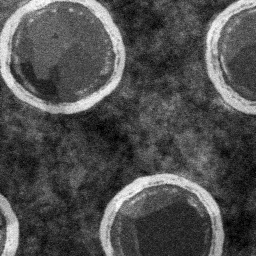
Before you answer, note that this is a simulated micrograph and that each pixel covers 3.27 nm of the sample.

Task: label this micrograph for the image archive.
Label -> raised bodies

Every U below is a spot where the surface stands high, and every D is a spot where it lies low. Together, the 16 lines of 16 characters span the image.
DDUUUUDDDDDDDDDU
DUUUUUUDDDDDDDUU
UUUUUUUDDDDDDUUU
UUUUUUUUDDDDDUUU
UUUUUUUDDDDDDUUU
DUUUUUUDDDDDDDUU
DDUUUDDDDDDDDDDU
DDDDDDDDDDDDDDDD
DDDDDDDDDDDDDDDD
DDDDDDDDDDDDDDDD
DDDDDDDDDDDDDDDD
DDDDDDDDDUUUDDDD
DDDDDDDUUUUUUDDD
UDDDDDDUUUUUUUDD
UDDDDDUUUUUUUUDD
UDDDDDDUUUUUUUDD